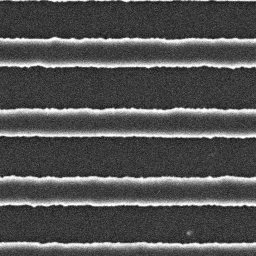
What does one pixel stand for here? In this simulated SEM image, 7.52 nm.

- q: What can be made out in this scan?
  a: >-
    lines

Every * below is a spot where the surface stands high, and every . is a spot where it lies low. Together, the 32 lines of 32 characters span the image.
................................
................................
................................
................................
................................
********************************
********************************
********************************
................................
................................
................................
................................
................................
................................
********************************
********************************
********************************
................................
................................
................................
................................
................................
********************************
********************************
********************************
********************************
................................
................................
................................
................................
********************************
********************************